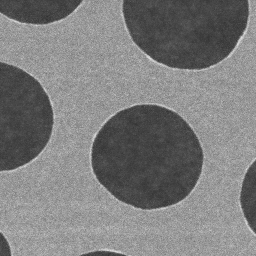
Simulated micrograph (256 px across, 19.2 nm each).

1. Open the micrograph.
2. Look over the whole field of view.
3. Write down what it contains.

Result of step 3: holes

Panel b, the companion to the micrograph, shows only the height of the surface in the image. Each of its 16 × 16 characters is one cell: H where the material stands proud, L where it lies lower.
LLLLLHHHLLLLLLLL
HHLHHHHHLLLLLLLH
HHHHHHHHLLLLLLLH
HHHHHHHHHLLLLLHH
LLHHHHHHHHHHHHHH
LLLHHHHHHHHHHHHH
LLLHHHHHHHHHHHHH
LLLHHHHLLLLLHHHH
LLLHHHLLLLLLHHHH
LLLHHHLLLLLLLHHH
LHHHHHLLLLLLLHHH
HHHHHHLLLLLLHHHL
HHHHHHHLLLLHHHHL
HHHHHHHHHHHHHHHL
HHHHHHHHHHHHHHHH
LHHHHHHHHHHHHHHH